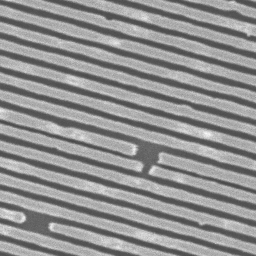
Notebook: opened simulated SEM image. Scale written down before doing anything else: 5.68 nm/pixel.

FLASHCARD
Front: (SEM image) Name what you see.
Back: parallel lines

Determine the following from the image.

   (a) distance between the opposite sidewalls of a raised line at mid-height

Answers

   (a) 56.8 nanometers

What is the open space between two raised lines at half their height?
0.0342 µm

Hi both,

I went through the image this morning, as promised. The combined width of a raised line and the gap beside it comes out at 92.1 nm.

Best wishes